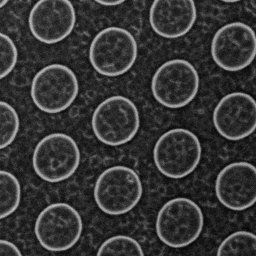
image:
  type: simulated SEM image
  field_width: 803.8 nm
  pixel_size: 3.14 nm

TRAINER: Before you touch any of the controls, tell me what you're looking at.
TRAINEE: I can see a regular array of raised bodies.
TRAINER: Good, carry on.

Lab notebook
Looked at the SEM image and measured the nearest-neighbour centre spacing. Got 218 nm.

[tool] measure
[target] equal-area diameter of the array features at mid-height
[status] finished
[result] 142 nm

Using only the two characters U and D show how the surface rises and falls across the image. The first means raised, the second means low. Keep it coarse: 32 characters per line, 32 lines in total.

DDDDDUUUUDDDDDDDDDDUUUUUDDDDDDDD
DDDDUUUUUDDDDDDDDDDUUUUUDDDDDDDD
DDDDUUUUUDDDDDDDDDDUUUUUDDDDDDDD
DDDDUUUUUDDDDDDDDDDUUUUUDDDDUUUD
DDDDDUUUDDDDUUUUDDDDDUDDDDDUUUUU
UUDDDDDDDDDDUUUUUDDDDDDDDDDUUUUU
UUDDDDDDDDDUUUUUUDDDDDDDDDDUUUUU
UUDDDDDDDDDDUUUUUDDDDDDDDDDUUUUD
UDDDDDUUDDDDUUUUDDDDUUUUDDDDUUDD
DDDDDUUUUDDDDDDDDDDUUUUUUDDDDDDD
DDDDUUUUUUDDDDDDDDDUUUUUUDDDDDDD
DDDDUUUUUDDDDDDDDDDUUUUUDDDDDDDD
DDDDUUUUUDDDDDUUDDDDUUUUDDDDUUUD
UDDDDUUUDDDDUUUUUDDDDDDDDDDUUUUU
UUDDDDDDDDDDUUUUUDDDDDDDDDDUUUUU
UUDDDDDDDDDDUUUUUDDDDDDDDDDUUUUU
UUDDDDDDDDDDUUUUUDDDDUUDDDDDUUUD
UDDDDDUUUDDDDUUUDDDDUUUUUDDDDDDD
DDDDDUUUUUDDDDDDDDDUUUUUUDDDDDDD
DDDDUUUUUUDDDDDDDDDUUUUUUDDDDDDD
DDDDUUUUUUDDDDDDDDDDUUUUDDDDDDUD
DDDDDUUUUDDDDUUUUDDDUUUUDDDDUUUU
UUDDDDUDDDDDUUUUUDDDDDDDDDDUUUUU
UUDDDDDDDDDDUUUUUUDDDDDDDDDUUUUU
UUDDDDDDDDDDUUUUUDDDDDDDDDDUUUUU
UUDDDDDDDDDDUUUUUDDDDUUUDDDDUUUD
UDDDDUUUUDDDDDUDDDDDUUUUUDDDDDDD
DDDDDUUUUUDDDDDDDDDDUUUUUDDDDDDD
DDDDDUUUUUDDDDDDDDDDUUUUUDDDDDDD
DDDDDUUUUUDDDDDDDDDDUUUUUDDDDUUU
UDDDDUUUUDDDDUUUUDDDDUUDDDDDUUUU
UUDDDDDDDDDDUUUUUUDDDDDDDDDUUUUU